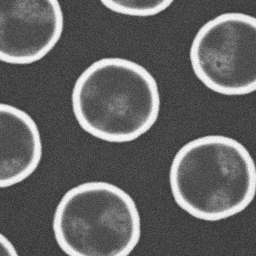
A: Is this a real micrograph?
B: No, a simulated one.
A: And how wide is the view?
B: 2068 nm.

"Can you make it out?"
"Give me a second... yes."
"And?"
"raised bodies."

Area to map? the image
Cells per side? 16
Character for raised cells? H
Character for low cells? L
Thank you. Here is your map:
HHHHLLLHHHLLLLLL
HHHHLLLLLLLLLHHH
HHHLLLLLLLLLHHHH
HHLLLLLLLLLLHHHH
LLLLLLHHHLLLHHHH
LLLLLHHHHHLLLLHH
LLLLLHHHHHLLLLLL
HHLLLHHHHLLLLLLL
HHLLLLLHLLLLLLLL
HHLLLLLLLLLHHHHL
HHLLLLLLLLLHHHHH
LLLLLLLLLLLHHHHH
LLLLHHHHLLLHHHHL
LLLLHHHHLLLLLHLL
LLLLHHHHHLLLLLLL
HLLLHHHHLLLLLLLL